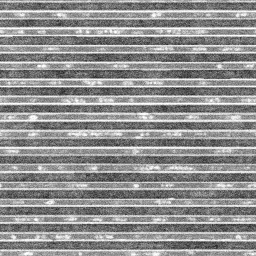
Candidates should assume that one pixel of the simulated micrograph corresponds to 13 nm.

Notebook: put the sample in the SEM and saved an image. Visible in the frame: parallel lines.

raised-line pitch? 221 nm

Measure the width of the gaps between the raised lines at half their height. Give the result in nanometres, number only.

133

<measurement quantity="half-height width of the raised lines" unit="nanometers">97.2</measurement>